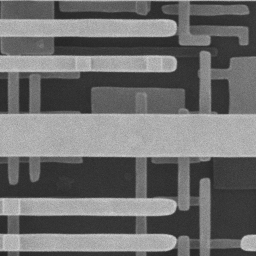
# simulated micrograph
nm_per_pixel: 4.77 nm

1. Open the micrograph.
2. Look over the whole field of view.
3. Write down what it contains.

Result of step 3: wiring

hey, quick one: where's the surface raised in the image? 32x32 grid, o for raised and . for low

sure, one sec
................................
................................
ooooooooooooooooooooo...........
oooooooooooooooooooooo..........
ooooooooooooooooooooo...........
................................
................................
oooooooooooooooooooooo..........
oooooooooooooooooooooo..........
................................
................................
................................
................................
................................
oooooooooooooooooooooooooooooooo
oooooooooooooooooooooooooooooooo
oooooooooooooooooooooooooooooooo
oooooooooooooooooooooooooooooooo
oooooooooooooooooooooooooooooooo
...........ooooooooooooooooooooo
................................
................................
................................
................................
................................
oooooooooooooooooooooo..........
oooooooooooooooooooooo..........
................................
................................
oooooooooooooooooooooo.........o
oooooooooooooooooooooo........oo
................................